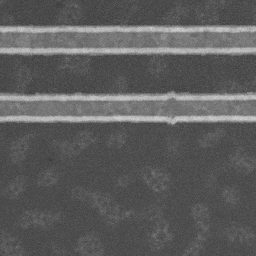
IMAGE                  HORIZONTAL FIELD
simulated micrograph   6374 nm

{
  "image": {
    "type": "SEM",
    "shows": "one or a few lines or trenches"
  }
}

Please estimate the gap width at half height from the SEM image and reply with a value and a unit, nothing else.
1190 nanometres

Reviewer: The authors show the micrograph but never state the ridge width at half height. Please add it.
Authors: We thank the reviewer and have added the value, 0.523 µm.